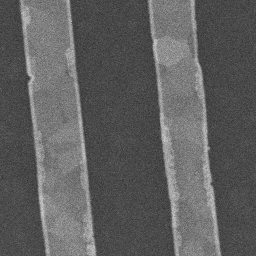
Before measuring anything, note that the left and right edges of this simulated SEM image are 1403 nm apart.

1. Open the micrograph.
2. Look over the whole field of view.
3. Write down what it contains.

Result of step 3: one or a few lines or trenches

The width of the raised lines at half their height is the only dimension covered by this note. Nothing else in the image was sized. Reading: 236 nm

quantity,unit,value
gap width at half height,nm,451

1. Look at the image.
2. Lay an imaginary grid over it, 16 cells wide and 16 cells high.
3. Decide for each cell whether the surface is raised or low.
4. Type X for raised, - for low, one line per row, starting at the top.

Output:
-XXX-----XXX----
--XX------XX----
--XX------XX----
--XXX-----XX----
--XXX-----XXX---
--XXX-----XXX---
--XXX-----XXX---
--XXX-----XXX---
--XXX-----XXX---
--XXX-----XXX---
--XXX-----XXX---
--XXX------XX---
---XX------XX---
---XXX-----XX---
---XXX-----XXX--
---XXX-----XXX--